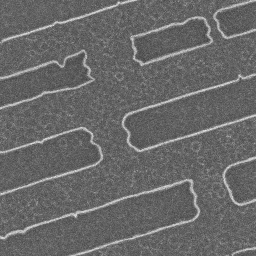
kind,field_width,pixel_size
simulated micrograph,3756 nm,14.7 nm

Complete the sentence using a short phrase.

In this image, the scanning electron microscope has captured one or a few lines or trenches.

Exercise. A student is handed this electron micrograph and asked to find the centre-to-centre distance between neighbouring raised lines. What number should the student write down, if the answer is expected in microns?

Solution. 1.16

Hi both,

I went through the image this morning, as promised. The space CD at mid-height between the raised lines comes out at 568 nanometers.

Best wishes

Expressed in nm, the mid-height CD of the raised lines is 620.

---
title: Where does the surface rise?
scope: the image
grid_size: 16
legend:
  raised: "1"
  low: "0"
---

0000000111111100
0001111111100100
1111111100000111
1111011110011111
1000001111111111
0000011111111000
0111111111000000
1111111100000001
1110001100001111
0000001111111111
0000011111111100
0011111111101100
1111111000001110
1111000000001111
1000000000111111
0000001111111111